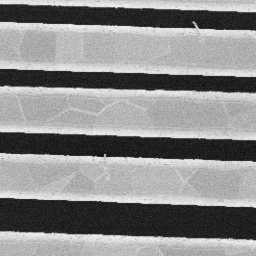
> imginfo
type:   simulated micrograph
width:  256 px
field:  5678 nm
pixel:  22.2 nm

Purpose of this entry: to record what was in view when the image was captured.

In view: lines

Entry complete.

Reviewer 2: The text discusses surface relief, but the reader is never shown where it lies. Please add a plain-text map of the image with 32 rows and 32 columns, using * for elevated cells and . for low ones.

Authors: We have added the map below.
.............*******************
................................
................................
**********......................
********************************
********************************
********************************
********************************
........************************
................................
................................
************....................
********************************
********************************
********************************
********************************
..............******************
................................
................................
................................
***************************.....
********************************
********************************
********************************
.....***************************
................................
................................
................................
................................
********........................
********************************
********************************